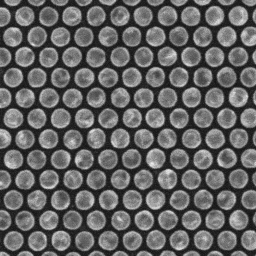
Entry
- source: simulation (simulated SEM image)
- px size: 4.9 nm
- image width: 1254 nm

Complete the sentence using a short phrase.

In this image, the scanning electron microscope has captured a regular array of raised bodies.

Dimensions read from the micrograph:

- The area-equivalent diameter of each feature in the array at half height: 0.0902 micrometres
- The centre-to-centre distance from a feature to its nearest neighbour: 113 nm